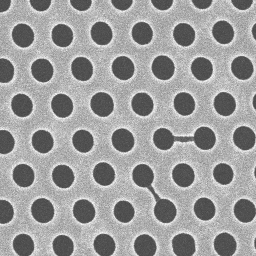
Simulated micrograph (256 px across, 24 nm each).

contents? a regular array of holes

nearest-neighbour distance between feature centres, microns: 0.951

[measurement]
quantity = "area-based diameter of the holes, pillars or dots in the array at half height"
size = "0.56 micrometres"